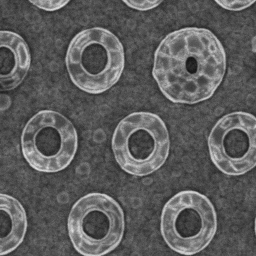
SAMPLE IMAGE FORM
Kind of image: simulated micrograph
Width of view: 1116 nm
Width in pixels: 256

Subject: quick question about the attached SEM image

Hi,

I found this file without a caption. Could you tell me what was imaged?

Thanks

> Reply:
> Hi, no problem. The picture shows ring-shaped raised bodies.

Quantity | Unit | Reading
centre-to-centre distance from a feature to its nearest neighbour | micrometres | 0.4